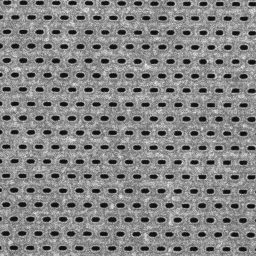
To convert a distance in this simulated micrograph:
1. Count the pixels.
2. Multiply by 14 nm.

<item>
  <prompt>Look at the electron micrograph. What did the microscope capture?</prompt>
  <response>a regular array of holes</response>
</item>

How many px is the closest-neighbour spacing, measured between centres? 16.1